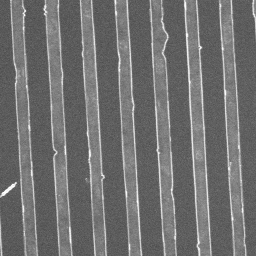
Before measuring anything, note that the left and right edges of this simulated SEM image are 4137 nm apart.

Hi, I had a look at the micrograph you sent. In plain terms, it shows parallel lines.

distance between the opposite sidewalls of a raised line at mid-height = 371 nanometers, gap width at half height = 180 nanometres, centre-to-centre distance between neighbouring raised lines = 34.8 px